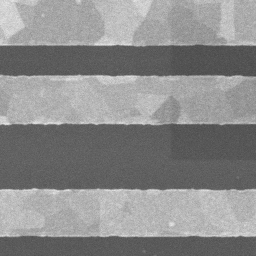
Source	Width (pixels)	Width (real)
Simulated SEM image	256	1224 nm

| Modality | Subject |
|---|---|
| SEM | lines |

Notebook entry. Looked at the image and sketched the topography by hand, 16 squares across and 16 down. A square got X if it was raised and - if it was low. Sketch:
XXXXXXXXXXXXXXXX
XXXXXXXXXXXXXXXX
XXXXXXXXXXXXXXXX
----------------
----------------
XXXXXXXXXXXXXXXX
XXXXXXXXXXXXXXXX
XXXXXXXXXXXXXXXX
----------------
----------------
----------------
----------------
XXXXXXXXXXXXXXXX
XXXXXXXXXXXXXXXX
XXXXXXXXXXXXXXXX
----------------